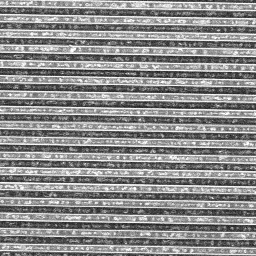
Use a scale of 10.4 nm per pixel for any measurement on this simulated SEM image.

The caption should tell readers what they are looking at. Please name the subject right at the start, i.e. parallel lines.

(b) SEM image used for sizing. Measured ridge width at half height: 75.7 nm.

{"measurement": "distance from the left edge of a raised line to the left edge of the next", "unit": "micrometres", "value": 0.159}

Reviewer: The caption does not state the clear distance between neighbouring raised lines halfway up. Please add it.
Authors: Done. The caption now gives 84.8 nanometers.